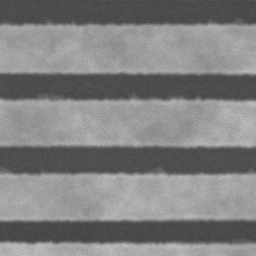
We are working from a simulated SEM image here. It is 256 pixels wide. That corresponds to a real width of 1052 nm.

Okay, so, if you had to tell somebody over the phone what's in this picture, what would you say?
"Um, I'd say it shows lines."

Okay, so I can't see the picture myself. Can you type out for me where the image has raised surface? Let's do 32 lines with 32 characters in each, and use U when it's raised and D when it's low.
DDDDDDDDDDDDDDDDDDDDDDDDDDDDDDDD
DDDDDDDDDDDDDDDDDDDDDDDDDDDDDDDD
DDDDDDDDDDDDDDDDDDDDDDDDDDDDDDDD
UUUUUUUUUUUUUUUUUUUUUUUUUUUUUUUU
UUUUUUUUUUUUUUUUUUUUUUUUUUUUUUUU
UUUUUUUUUUUUUUUUUUUUUUUUUUUUUUUU
UUUUUUUUUUUUUUUUUUUUUUUUUUUUUUUU
UUUUUUUUUUUUUUUUUUUUUUUUUUUUUUUU
UUUUUUUUUUUUUUUUUUUUUUUUUUUUUUUU
DDDDDDDDDDDDDDDDDDDDDDDDDDDDDDDD
DDDDDDDDDDDDDDDDDDDDDDDDDDDDDDDD
DDDDDDDDDDDDDDDDDDDDDDDDDDDDDDDD
DDDUUUDDDDDDDDDDUDDUDDUDDDDDDDDD
UUUUUUUUUUUUUUUUUUUUUUUUUUUUUUUU
UUUUUUUUUUUUUUUUUUUUUUUUUUUUUUUU
UUUUUUUUUUUUUUUUUUUUUUUUUUUUUUUU
UUUUUUUUUUUUUUUUUUUUUUUUUUUUUUUU
UUUUUUUUUUUUUUUUUUUUUUUUUUUUUUUU
DDDDDDDDDDDDDDDDDDDDDDDDDDDDDDDD
DDDDDDDDDDDDDDDDDDDDDDDDDDDDDDDD
DDDDDDDDDDDDDDDDDDDDDDDDDDDDDDDD
DDDDDDDDDDDDDDDDDDDDDDDDDDDDDDDD
UUUUUUUUUUUUUUUUUUUUUUUUUUUUUUUU
UUUUUUUUUUUUUUUUUUUUUUUUUUUUUUUU
UUUUUUUUUUUUUUUUUUUUUUUUUUUUUUUU
UUUUUUUUUUUUUUUUUUUUUUUUUUUUUUUU
UUUUUUUUUUUUUUUUUUUUUUUUUUUUUUUU
UUUUUUUUUUUUUUUUUUUUUUUUUUUUUUUU
DDDDDDDDDDDDDDDDDDDDDDDDDDDDDDDD
DDDDDDDDDDDDDDDDDDDDDDDDDDDDDDDD
UUUUUUUUUUUUUUUUUUUUUUUUUUUUUDUU
UUUUUUUUUUUUUUUUUUUUUUUUUUUUUUUU